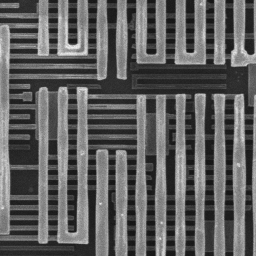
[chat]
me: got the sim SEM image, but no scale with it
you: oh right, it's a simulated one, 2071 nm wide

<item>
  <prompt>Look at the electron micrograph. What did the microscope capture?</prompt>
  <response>wiring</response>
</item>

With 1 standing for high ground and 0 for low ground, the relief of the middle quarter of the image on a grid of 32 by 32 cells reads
00000000111001110000000000000000
00000000111001110000000000000000
00000000111001110000000000000000
00000000110000110000000000000000
00000000000000000000000000000000
00000000000000000000000000000000
10011100000000000000000000000000
10011100000000000000000000000000
10011100000000000011000110001100
10011100000000000011000110001100
10001100000000000011000110001100
10001100000000000011000110001100
10001100000000000011000110001100
10001100000000000011000110001100
10001100000000000011000110001100
10001100000000000011000110001100
10001100000000000011000110001100
10011100000000000011000110001100
10011100000000000011000110001100
10011100000000000011000110001100
10011100000000000011000110001100
10011100111001000011000110001100
10011100111001110011000110001100
10011100111001110011000110001100
10011100111001110011000110001100
10011100111001110011000110001100
10001100111001110011000110001100
10001100111001110011000110001100
10001100111001110011000110001100
10001100111001110011000110001100
10001100111001110011000111001100
10001100111001110011000111001100